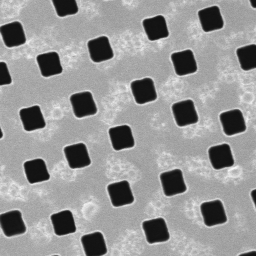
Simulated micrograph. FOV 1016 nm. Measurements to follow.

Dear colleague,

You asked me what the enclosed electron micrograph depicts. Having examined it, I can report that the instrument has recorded a regular array of holes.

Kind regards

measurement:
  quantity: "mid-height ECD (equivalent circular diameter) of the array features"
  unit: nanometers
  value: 95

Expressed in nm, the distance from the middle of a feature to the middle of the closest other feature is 201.